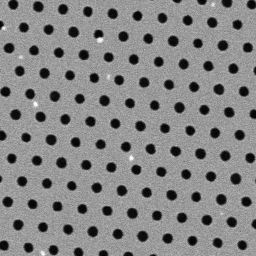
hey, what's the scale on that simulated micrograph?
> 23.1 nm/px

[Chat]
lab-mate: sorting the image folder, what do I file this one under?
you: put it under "a regular array of holes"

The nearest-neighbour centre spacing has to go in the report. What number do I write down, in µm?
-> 0.573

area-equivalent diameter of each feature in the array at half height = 0.247 microns